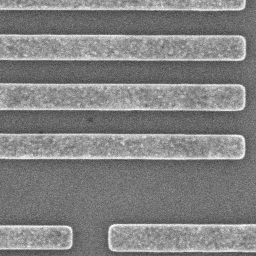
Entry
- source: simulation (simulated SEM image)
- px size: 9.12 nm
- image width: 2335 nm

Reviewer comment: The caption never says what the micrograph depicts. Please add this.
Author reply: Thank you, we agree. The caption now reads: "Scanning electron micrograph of wiring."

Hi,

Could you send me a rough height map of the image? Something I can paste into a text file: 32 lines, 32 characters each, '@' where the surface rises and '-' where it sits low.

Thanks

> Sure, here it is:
@@@@@@@@@@@@@@@@@@@@@@@@@@@@@@@-
--------------------------------
--------------------------------
--------------------------------
@@@@@@@@@@@@@@@@@@@@@@@@@@@@@@--
@@@@@@@@@@@@@@@@@@@@@@@@@@@@@@@-
@@@@@@@@@@@@@@@@@@@@@@@@@@@@@@@-
--------------------------------
--------------------------------
--------------------------------
--------------------------------
@@@@@@@@@@@@@@@@@@@@@@@@@@@@@@@-
@@@@@@@@@@@@@@@@@@@@@@@@@@@@@@@-
@@@@@@@@@@@@@@@@@@@@@@@@@@@@@@--
--------------------------------
--------------------------------
--------------------------------
@@@@@@@@@@@@@@@@@@@@@@@@@@@@@@@-
@@@@@@@@@@@@@@@@@@@@@@@@@@@@@@@-
@@@@@@@@@@@@@@@@@@@@@@@@@@@@@@--
--------------------------------
--------------------------------
--------------------------------
--------------------------------
--------------------------------
--------------------------------
--------------------------------
--------------------------------
@@@@@@@@@-----@@@@@@@@@@@@@@@@@@
@@@@@@@@@-----@@@@@@@@@@@@@@@@@@
@@@@@@@@@-----@@@@@@@@@@@@@@@@@@
--------------------------------